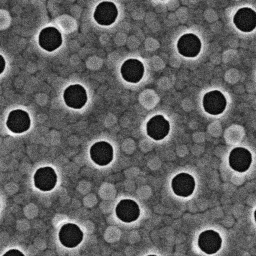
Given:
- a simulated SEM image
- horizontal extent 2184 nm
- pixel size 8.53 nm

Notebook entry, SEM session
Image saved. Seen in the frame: a regular array of holes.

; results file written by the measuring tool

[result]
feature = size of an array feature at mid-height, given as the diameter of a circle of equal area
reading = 24.7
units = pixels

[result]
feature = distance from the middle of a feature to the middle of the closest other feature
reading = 0.528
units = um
